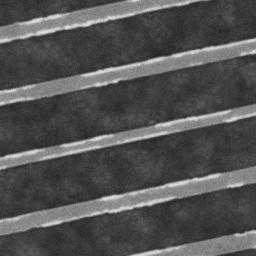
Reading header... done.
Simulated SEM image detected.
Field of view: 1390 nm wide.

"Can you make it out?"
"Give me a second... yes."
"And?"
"one or a few lines or trenches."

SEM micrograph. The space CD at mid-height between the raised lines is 270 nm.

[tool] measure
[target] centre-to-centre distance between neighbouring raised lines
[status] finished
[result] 342 nm